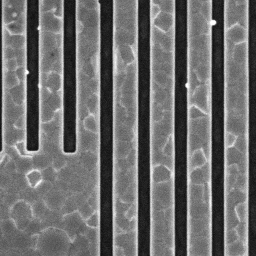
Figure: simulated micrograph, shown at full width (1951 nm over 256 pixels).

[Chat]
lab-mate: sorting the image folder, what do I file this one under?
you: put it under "parallel lines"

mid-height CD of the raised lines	180	nanometers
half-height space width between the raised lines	97.2	nm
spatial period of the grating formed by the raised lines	283	nm